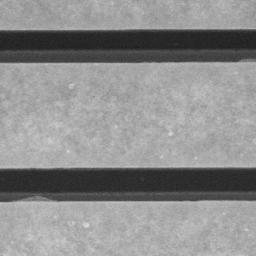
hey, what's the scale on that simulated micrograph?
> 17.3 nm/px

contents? lines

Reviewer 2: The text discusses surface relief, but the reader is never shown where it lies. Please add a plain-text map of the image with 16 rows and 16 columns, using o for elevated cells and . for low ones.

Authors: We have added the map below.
oooooooooooooooo
oooooooooooooooo
................
................
oooooooooooooooo
oooooooooooooooo
oooooooooooooooo
oooooooooooooooo
oooooooooooooooo
oooooooooooooooo
ooooo...........
................
................
oooooooooooooooo
oooooooooooooooo
oooooooooooooooo